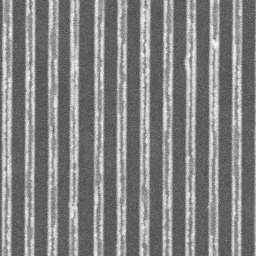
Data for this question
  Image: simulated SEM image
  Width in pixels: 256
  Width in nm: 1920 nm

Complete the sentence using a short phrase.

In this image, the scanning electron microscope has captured parallel lines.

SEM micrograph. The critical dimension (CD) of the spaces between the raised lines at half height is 0.11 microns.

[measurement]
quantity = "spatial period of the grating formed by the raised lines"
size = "172 nm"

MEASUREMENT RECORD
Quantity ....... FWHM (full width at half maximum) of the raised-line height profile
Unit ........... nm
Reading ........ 60.9